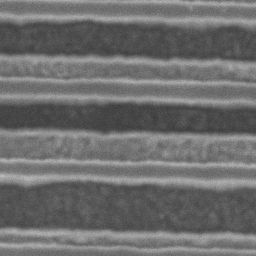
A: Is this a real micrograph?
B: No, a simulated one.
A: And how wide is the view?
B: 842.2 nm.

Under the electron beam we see lines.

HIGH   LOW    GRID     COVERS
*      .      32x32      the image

********************************
********************************
............********************
................................
................................
................................
................................
*******************.............
********************************
********************************
********************************
********************************
..........*.*.******************
................................
................................
................................
********........................
********************************
********************************
********************************
********************************
********************************
...*.........*******************
................................
................................
................................
................................
................................
................................
************************...***..
********************************
********************************